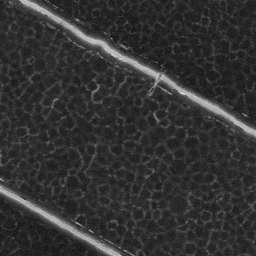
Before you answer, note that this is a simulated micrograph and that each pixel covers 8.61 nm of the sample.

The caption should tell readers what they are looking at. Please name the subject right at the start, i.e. one or a few lines or trenches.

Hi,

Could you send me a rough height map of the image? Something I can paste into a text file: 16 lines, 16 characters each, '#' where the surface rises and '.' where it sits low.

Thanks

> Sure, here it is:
##..............
####............
######..........
#######.........
#########.......
###########.....
#############...
###############.
################
################
################
################
.###############
...#############
.....###########
......##########